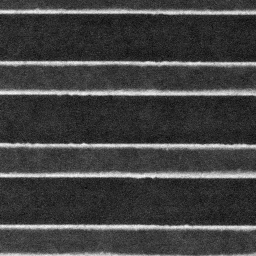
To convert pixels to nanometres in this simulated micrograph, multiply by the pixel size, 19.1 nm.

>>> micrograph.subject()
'lines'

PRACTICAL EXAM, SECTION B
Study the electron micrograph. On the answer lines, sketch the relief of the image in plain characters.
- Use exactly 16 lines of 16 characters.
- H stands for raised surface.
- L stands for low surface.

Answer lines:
HHHHHHHHHHHHHHHH
LLLLLLLLLLLLLLLL
LLLLLLLLLLLLLLLL
LLLLLLLLLLLLLLLL
HHHHHHHHHHHHHHHH
HHHHHHHHHHHHHHHH
LLLLLLLLLLLLLLLL
LLLLLLLLLLLLLLLL
LLLLLLLLLLLLLLLL
HHHHHHHHHHHHHHHH
HHHHHHHHHHHHHHHH
LLLLLLLLLLLLLLLL
LLLLLLLLLLLLLLLL
LLLLLLLLLLLLLLLL
HHHHHHHHHHHHHHHH
HHHHHHHHHHHHHHHH